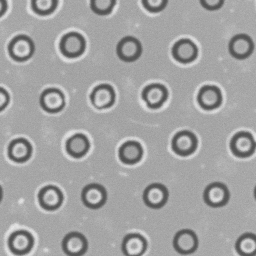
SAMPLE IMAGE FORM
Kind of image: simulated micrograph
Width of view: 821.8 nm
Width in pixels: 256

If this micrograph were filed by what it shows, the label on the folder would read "a regular array of ring-shaped grooves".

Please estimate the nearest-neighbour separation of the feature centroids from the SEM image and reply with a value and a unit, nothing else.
168 nm